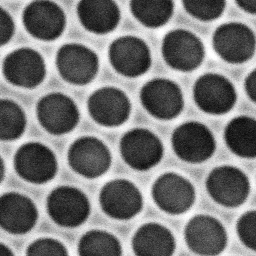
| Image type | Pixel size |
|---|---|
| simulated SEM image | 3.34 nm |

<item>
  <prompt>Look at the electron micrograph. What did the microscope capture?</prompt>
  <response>a regular array of holes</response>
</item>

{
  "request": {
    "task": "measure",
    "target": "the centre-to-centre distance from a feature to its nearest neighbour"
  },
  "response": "176 nanometers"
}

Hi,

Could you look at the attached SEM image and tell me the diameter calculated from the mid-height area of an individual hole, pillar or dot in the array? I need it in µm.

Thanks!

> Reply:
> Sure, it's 0.148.